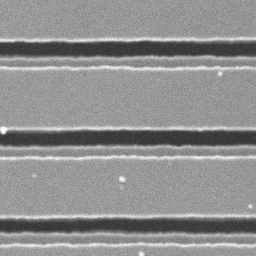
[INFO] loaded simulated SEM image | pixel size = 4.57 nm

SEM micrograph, lines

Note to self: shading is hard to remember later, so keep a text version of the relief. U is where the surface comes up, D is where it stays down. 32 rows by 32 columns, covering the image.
UUUUUUUUUUUUUUUUUUUUUUUUUUUUUUUU
UUUUUUUUUUUUUUUUUUUUUUUUUUUUUUUU
UUUUUUUUUUUUUUUUUUUUUUUUUUUUUUUU
UUUUUUUUUUUUUUUUUUUUUUUUUUUUUUUU
UUUUUUUUUUUUUUUUUUUUUUUUUUUUUUUU
DDDDDDDDDDDDDDDDDDDDDDDDDDDDDDDD
DDDDDDDDDDDDDDDDDDDDDDDDDDDDDDDD
UUUUUUUUUUUUUUUUUUUUUUUUUUUUUUUU
UUUUUUUUUUUUUUUUUUUUUUUUUUUUUUUU
UUUUUUUUUUUUUUUUUUUUUUUUUUUUUUUU
UUUUUUUUUUUUUUUUUUUUUUUUUUUUUUUU
UUUUUUUUUUUUUUUUUUUUUUUUUUUUUUUU
UUUUUUUUUUUUUUUUUUUUUUUUUUUUUUUU
UUUUUUUUUUUUUUUUUUUUUUUUUUUUUUUU
UUUUUUUUUUUUUUUUUUUUUUUUUUUUUUUU
UUUUUUUUUUUUUUUUUUUUUUUUUUUUUUUU
DDDDDDDDDDDDDDDDDDDDDDDDDDDDDDDD
DDDDDDDDDDDDDDDDDDDDDDDDDDDDDDDD
UUDUUDDUUUUUUUUUUUUUUUUUUUUUUUUU
UUUUUUUUUUUUUUUUUUUUUUUUUUUUUUUU
UUUUUUUUUUUUUUUUUUUUUUUUUUUUUUUU
UUUUUUUUUUUUUUUUUUUUUUUUUUUUUUUU
UUUUUUUUUUUUUUUUUUUUUUUUUUUUUUUU
UUUUUUUUUUUUUUUUUUUUUUUUUUUUUUUU
UUUUUUUUUUUUUUUUUUUUUUUUUUUUUUUU
UUUUUUUUUUUUUUUUUUUUUUUUUUUUUUUU
UUUUUUUUUUUUUUUUUUUUUUUUUUUUUUUU
DDDDDDDDDDDDDDDDDDDDDDDDDDDDDDDD
DDDDDDDDDDDDDDDDDDDDDDDDDDDDDDDD
UUUUUUUUUUUUUUUUUUUUUUUUUUUUUUUU
UUUUUUUUUUUUUUUUUUUUUUUUUUUUUUUU
UUUUUUUUUUUUUUUUUUUUUUUUUUUUUUUU